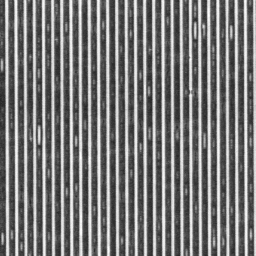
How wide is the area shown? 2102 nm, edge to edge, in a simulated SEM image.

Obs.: parallel lines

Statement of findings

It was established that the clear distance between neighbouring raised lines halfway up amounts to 54.4 nm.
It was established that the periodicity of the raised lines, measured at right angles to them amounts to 75.3 nanometres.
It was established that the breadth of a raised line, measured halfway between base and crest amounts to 0.0154 micrometres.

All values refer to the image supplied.